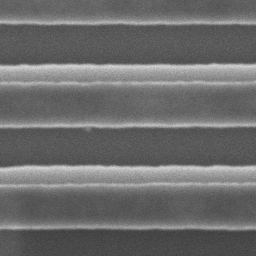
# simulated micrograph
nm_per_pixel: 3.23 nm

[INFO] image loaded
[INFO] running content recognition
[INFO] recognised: lines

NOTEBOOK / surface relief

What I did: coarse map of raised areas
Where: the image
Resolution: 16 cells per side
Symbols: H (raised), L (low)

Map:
HHHHHHHHHHHHHHHH
LLLLLLLLLLLLLLLL
LLLLLLLLLLLLLLLL
LLLLLLLLLLLLLLLL
HHHHHHHHHHHHHHHH
HHHHHHHHHHHHHHHH
HHHHHHHHHHHHHHHH
HHHHHHHHHHHHHHHH
LLLLLLLLLLLLLLLL
LLLLLLLLLLLLLLLL
HHHHHHHHHHHHHHHH
HHHHHHHHHHHHHHHH
HHHHHHHHHHHHHHHH
HHHHHHHHHHHHHHHH
LLLLLLLLLLLLLLLL
LLLLLLLLLLLLLLLL